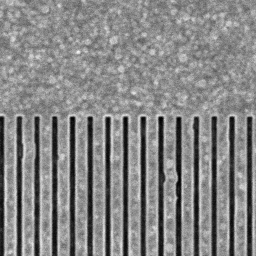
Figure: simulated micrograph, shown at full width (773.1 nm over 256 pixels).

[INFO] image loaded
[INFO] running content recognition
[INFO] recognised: parallel lines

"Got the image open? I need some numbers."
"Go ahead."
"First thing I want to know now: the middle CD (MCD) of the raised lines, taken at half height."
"0.0363 microns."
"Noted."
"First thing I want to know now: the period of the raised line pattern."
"53.7 nm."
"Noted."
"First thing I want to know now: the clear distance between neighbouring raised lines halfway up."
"16.6 nm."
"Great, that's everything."